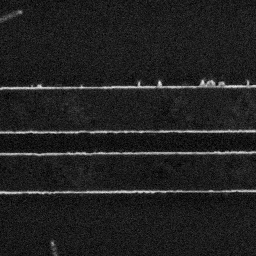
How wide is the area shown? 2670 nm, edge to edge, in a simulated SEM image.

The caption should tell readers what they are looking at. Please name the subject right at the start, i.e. lines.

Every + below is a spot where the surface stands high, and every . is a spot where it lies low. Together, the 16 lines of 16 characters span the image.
................
................
................
................
................
++++++++++++++++
++++++++++++++++
++++++++++++++++
................
................
++++++++++++++++
++++++++++++++++
................
................
................
................